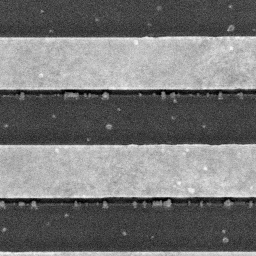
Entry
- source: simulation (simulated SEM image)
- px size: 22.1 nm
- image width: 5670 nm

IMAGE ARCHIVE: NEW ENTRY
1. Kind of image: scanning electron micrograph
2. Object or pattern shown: lines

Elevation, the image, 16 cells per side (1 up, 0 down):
0000000000000000
0000000000000000
1111111111111111
1111111111111111
1111111111111111
1111111111111111
0000000000000000
0000000000000000
0000000000000000
1111111111111111
1111111111111111
1111111111111111
0000000000000000
0000000000000000
0000000000000000
0000000000000000